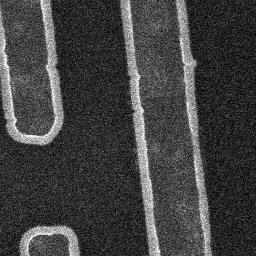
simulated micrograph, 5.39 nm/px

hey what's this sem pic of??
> one or a few lines or trenches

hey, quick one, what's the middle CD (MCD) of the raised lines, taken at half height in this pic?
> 296 nanometers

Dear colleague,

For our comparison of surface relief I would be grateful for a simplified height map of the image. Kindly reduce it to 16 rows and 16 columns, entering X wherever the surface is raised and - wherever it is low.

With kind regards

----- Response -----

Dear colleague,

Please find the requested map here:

XXX-----XXX-----
XXX-----XXX-----
XXX-----XXXX----
XXX-----XXXX----
XXX-----XXXX----
XXXX----XXXX----
XXXX-----XXX----
-XXX-----XXX----
-XX------XXX----
---------XXX----
---------XXX----
---------XXXX---
---------XXXX---
---------XXXX---
--XX-----XXXX---
--XXX-----XXX---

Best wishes